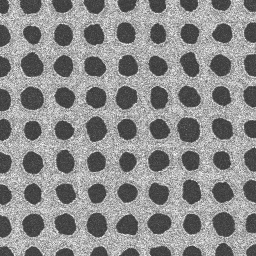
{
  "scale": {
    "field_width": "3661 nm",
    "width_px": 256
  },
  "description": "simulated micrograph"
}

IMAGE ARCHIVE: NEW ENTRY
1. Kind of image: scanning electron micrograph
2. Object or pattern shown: a regular array of holes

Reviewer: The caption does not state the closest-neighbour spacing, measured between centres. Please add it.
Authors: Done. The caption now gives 440 nm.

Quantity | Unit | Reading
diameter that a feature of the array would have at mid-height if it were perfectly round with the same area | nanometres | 303